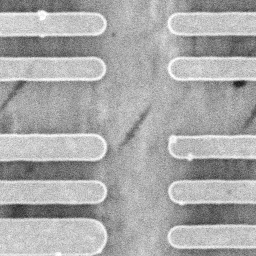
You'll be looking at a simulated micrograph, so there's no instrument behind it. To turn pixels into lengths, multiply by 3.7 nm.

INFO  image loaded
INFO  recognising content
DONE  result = groups of lines, slits or small figures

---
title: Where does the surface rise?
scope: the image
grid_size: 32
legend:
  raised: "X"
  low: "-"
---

--------------------------------
-----X--------------------------
XXXXXXXXXXXXX--------XXXXXXXXXXX
XXXXXXXXXXXXX--------XXXXXXXXXXX
--------------------------------
--------------------------------
--------------------------------
XXXXXXXXXXXX----------XXXXXXXXXX
XXXXXXXXXXXXX--------XXXXXXXXXXX
XXXXXXXXXXXXX---------XXXXXXXXXX
--------------------------------
--------------------------------
--------------------------------
--------------------------------
--------------------------------
--------------------------------
--------------------------------
XXXXXXXXXXXXX--------XXXXXXXXXXX
XXXXXXXXXXXXX--------XXXXXXXXXXX
XXXXXXXXXXXXX---------XXXXXXXXXX
--------------------------------
--------------------------------
--------------------------------
XXXXXXXXXXXXX--------XXXXXXXXXXX
XXXXXXXXXXXXX--------XXXXXXXXXXX
--------------------------------
--------------------------------
XXXXXXXXXXX---------------------
XXXXXXXXXXXXX---------XXXXXXXXXX
XXXXXXXXXXXXX--------XXXXXXXXXXX
XXXXXXXXXXXXX---------XXXXXXXXXX
XXXXXXXXXXXX--------------------